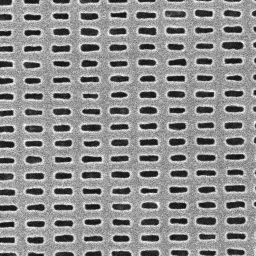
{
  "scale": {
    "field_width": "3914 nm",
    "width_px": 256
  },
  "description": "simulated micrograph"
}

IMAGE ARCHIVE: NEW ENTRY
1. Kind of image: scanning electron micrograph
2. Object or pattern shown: a regular array of holes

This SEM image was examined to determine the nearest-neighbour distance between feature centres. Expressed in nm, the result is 238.